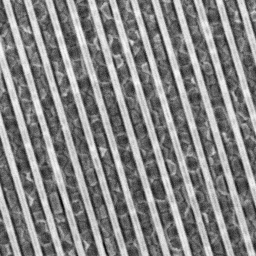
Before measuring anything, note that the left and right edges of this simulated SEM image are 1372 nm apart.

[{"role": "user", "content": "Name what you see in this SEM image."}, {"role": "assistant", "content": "parallel lines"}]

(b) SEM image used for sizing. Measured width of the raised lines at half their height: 5.88 pixels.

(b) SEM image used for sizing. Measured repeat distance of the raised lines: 0.11 microns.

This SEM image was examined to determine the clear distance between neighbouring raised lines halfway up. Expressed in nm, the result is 79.